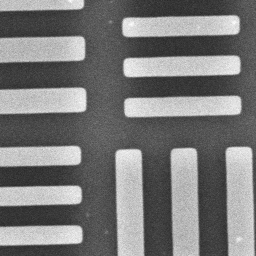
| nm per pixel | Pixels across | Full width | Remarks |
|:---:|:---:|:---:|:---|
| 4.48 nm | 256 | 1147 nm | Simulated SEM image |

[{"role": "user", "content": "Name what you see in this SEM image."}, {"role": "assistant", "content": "groups of lines, slits or small figures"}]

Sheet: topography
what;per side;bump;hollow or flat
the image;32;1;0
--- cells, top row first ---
11111111110000000000000000000000
00000000000000000000000000000000
00000000000000011111111111111100
00000000000000011111111111111100
00000000000000001110000000000000
11111111111000000000000000000000
11111111111000000000000000000000
11111111110000001111111111111100
00000000000000011111111111111100
00000000000000001110000000000000
00000000000000000000000000000000
11111111111000000000000000000000
11111111111000001111111111111100
11111111111000001111111111111100
00000000000000001111110000000000
00000000000000000000000000000000
00000000000000000000000000000000
00000000000000000000000000000000
01111111110000000000000000000110
11111111110000011100011110001110
11111111110000011100011110001110
00000000000000011100001110001110
00000000000000011100001110001111
11111111110000011100001110001111
11111111110000011100001110001111
11111111000000011100001110001111
00000000000000011100001110001111
00000000000000011100001110001111
11111111110000011100001110001111
11111111110000011100001110001111
11111111000000011100001110000111
00000000000000011100001110000111